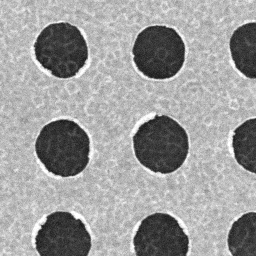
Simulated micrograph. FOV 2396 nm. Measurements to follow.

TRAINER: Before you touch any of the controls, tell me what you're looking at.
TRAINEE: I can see holes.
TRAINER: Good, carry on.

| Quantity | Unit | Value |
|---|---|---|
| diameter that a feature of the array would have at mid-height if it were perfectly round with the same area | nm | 522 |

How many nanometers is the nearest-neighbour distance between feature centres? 890